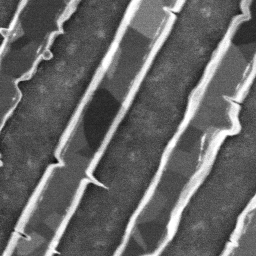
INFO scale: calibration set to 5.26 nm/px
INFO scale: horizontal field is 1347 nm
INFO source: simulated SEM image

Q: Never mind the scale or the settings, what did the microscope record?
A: one or a few lines or trenches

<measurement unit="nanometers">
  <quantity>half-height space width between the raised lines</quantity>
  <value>316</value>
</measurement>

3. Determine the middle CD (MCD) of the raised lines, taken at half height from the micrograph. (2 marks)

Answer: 203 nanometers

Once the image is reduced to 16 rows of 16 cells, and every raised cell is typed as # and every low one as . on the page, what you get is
.###....###....#
.###....###....#
###....###....##
###....##.....##
##....###....###
#.....##.....##.
#....###....###.
.....##.....###.
....###....###..
....##....###...
...###....###...
...##.....##....
..###....###....
..##....###....#
.###....###....#
.##.....##....##